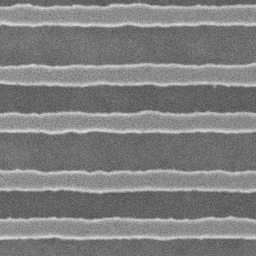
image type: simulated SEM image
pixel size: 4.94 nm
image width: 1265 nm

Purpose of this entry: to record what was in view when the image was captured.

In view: lines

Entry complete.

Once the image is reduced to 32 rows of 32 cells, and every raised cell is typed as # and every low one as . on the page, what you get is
.................#..............
################################
################################
................................
................................
................................
................................
................................
################################
################################
..################.######..#####
................................
................................
................................
################################
################################
###########..###################
................................
................................
................................
................................
#####..####.#.#########.####..##
################################
################################
................................
................................
................................
######################.#########
################################
################################
................................
................................